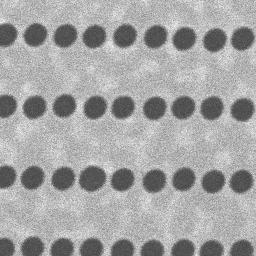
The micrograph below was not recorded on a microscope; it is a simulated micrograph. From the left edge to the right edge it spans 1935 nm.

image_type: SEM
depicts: a regular array of holes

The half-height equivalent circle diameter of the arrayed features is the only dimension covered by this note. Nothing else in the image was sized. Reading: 186 nanometres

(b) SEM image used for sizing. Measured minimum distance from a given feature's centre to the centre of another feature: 29.3 px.